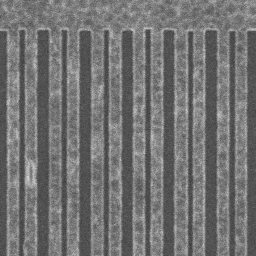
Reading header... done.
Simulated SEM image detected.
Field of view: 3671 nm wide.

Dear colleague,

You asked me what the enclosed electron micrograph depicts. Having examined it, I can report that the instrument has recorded parallel lines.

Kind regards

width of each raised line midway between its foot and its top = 150 nanometres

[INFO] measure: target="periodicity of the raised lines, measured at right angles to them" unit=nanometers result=297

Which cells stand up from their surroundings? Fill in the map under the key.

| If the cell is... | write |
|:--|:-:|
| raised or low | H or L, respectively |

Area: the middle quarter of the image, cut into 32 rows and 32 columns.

LHHLLLLHHHLLHHLLLLHHLLHHLLLLHHHL
LHHLLLLHHHLLHHLLLLHHLLHHLLLLHHHL
LHHLLLLHHHLLHHLLLLHHLLHHLLLLHHHL
LHHLLLLHHHLLHHLLLLHHLLHHHLLLHHHL
LHHLLLLHHHLLHHLLLLHHLLHHLLLLHHHL
LHHLLLLHHHLLHHLLLLHHLLHHLLLLHHHL
LHHLLLLHLHLLHHLLLLHHLLHHLLLLHHHL
LHHLLLLHLHLLHHLLLLHHLLHHLLLLHHHL
LHHLLLLHHHLLHHLLLLHHLLHHLLLLHHHL
LHHLLLLHHHLLHHLLLLHHLLHHLLLLHHHL
LHHLLLLHHHLLHHLLLLHHLLHHHLLLHHHL
LHHLLLLHHHLLHHLLLLLHLLHHHLLLHHHL
LHHLLLLHHHLLHHLLLLHHLLHHHLLLHHHL
LHHLLLLHHHLLHHLLLLHHLLHHHLLLHHHL
LHHLLLLHHHLLHHLLLLHHLLHHHLLLHHHL
LHHLLLLHHHLLHHLLLLHHLLHHHLLLHHHL
LHHLLLLHHHLLHHLLLLHHLLHHHLLLHHHL
LHHLLLLHHHLLHHLLLLHHLLHHHLLLHHHL
LHHLLLLHHHLLHHLLLLHHLLHHHLLLHHHL
LHHLLLLHHHLLHHLLLLHHLLHHHLLLHHHL
LHHLLLLHHHLLHHLLLLHHLLHHHLLLHHHL
LHHLLLLHHHLLHHLLLLHHLLHHHLLLHHHL
LHHLLLLHHHLLHHLLLLHHLLHHHLLLHHHL
LHHLLLLHHHLLHHLLLLHHLLHHLLLLHHHL
LHHLLLLHHHLLHHLLLLHHLLHHLLLLHHHL
LHHLLLLHHHLLHHLLLLHHLLHHHLLLHHHL
LHHLLLLHHHLLHHLLLLHHLLHHHLLLHHHL
LHHLLLLHHHLLHHLLLLHHLLHHLLLLHHHL
LHHLLLLHHHLLHHLLLLHHLLHHLLLLHHHL
LHHLLLLHHHLLHHLLLLHHLLHHLLLLHHHL
LHHLLLLHHHLLHHLLLLHHLLHHLLLLHHHL
LHHLLLLHHHLLHHLLLLHHLLHHLLLLHHHL